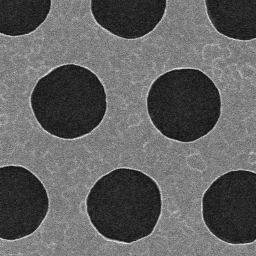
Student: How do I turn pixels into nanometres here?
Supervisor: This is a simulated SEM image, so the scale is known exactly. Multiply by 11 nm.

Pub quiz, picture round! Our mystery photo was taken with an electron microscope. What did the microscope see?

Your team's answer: holes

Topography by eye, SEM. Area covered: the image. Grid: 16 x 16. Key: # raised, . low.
...###....###...
...###....###...
################
################
###...####...###
##....###.....##
##.....##.....##
##....###.....##
###..#####...###
################
.###############
...###....###...
...##.....###...
...###....###...
..####...####...
################